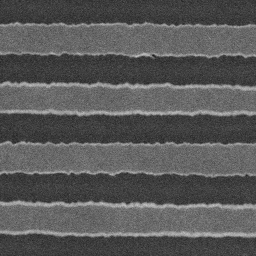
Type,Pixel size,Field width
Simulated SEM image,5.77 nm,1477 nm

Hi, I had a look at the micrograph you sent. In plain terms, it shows lines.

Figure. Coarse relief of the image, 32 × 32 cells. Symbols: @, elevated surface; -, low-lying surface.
--------------------------------
--------------------------------
--------------------------------
@@@@@@@@@@@@@@@@@@@@@@@@@@@@@@@@
@@@@@@@@@@@@@@@@@@@@@@@@@@@@@@@@
@@@@@@@@@@@@@@@@@@@@@@@@@@@@@@@@
@@@@@@@@@@@@@@@@@@@@@@@@@@@@@@@@
--------------------------------
--------------------------------
--------------------------------
@@@@@-@@@@--@-------@-----------
@@@@@@@@@@@@@@@@@@@@@@@@@@@@@@@@
@@@@@@@@@@@@@@@@@@@@@@@@@@@@@@@@
@@@@@@@@@@@@@@@@@@@@@@@@@@@@@@@@
--------------------------------
--------------------------------
--------------------------------
--------------------------------
@@@@@@@@@@@@@@@@@@@@@@@@@@@@@@@@
@@@@@@@@@@@@@@@@@@@@@@@@@@@@@@@@
@@@@@@@@@@@@@@@@@@@@@@@@@@@@@@@@
@@@@@@@@@@@@@@@@@@@@@@@@@@@@@@@@
--------------------------------
--------------------------------
--------------------------------
@@@@@@@@@@@@@@-@@@@-------------
@@@@@@@@@@@@@@@@@@@@@@@@@@@@@@@@
@@@@@@@@@@@@@@@@@@@@@@@@@@@@@@@@
@@@@@@@@@@@@@@@@@@@@@@@@@@@@@@@@
----------@@-@-@@@@@---@@@@@-@@@
--------------------------------
--------------------------------